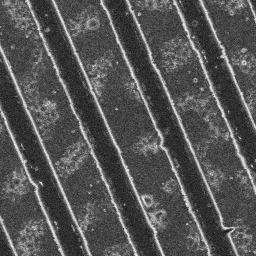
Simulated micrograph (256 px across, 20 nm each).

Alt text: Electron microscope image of one or a few lines or trenches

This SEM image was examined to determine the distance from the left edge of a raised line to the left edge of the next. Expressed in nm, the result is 1350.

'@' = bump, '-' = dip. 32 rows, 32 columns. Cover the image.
@@@@---@@@@@@---@@@@@@---@@@@@@-
@@@@---@@@@@@----@@@@@----@@@@@@
@@@@----@@@@@@---@@@@@@---@@@@@@
@@@@@---@@@@@@---@@@@@@----@@@@@
@@@@@----@@@@@@---@@@@@@---@@@@@
@@@@@@---@@@@@@---@@@@@@---@@@@@
@@@@@@---@@@@@@----@@@@@@---@@@@
-@@@@@@---@@@@@@---@@@@@@---@@@@
-@@@@@@---@@@@@@---@@@@@@----@@@
--@@@@@----@@@@@@---@@@@@@---@@@
--@@@@@@---@@@@@@---@@@@@@----@@
--@@@@@@----@@@@@@---@@@@@@---@@
---@@@@@@---@@@@@@---@@@@@@---@@
---@@@@@@----@@@@@----@@@@@@---@
----@@@@@@---@@@@@@---@@@@@@---@
@---@@@@@@---@@@@@@----@@@@@----
@----@@@@@----@@@@@@---@@@@@@---
@@---@@@@@@---@@@@@@---@@@@@@---
@@---@@@@@@----@@@@@----@@@@@@--
@@@---@@@@@@---@@@@@@---@@@@@@--
@@@---@@@@@@----@@@@@----@@@@@@-
@@@----@@@@@@---@@@@@@---@@@@@@-
@@@@---@@@@@@---@@@@@@----@@@@@-
@@@@@---@@@@@@---@@@@@@---@@@@@@
@@@@@---@@@@@@---@@@@@@----@@@@@
@@@@@---@@@@@@----@@@@@@---@@@@@
@@@@@@---@@@@@@---@@@@@@---@@@@@
@@@@@@---@@@@@@----@@@@@----@@@@
-@@@@@----@@@@@@---@@@@@@---@@@@
-@@@@@@---@@@@@@---@@@@@@----@@@
-@@@@@@----@@@@@----@@@@@@---@@@
--@@@@@@---@@@@@@---@@@@@@----@@